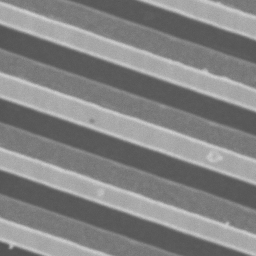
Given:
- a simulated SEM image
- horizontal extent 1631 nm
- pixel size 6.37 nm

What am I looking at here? lines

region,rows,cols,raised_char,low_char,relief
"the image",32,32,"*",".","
**********.........*************
*************.........**********
***************..........*******
.*****************.........*****
....*****************.........**
.......*****************........
*.........*****************.....
****.........*****************..
*******.........****************
**********.........*************
*************.........**********
****************.........*******
.*****************..........****
....*****************.........**
.......******************.......
..........*****************.....
***.........******************..
******.........*****************
*********.........**************
************.........***********
***************.........********
.*****************.........*****
....*****************.........**
.......*****************........
*.........*****************.....
***.........******************..
******.........*****************
*********.........**************
************.........***********
***************.........********
.*****************.........*****
....*****************.........**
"